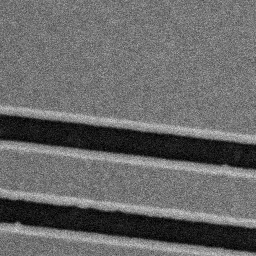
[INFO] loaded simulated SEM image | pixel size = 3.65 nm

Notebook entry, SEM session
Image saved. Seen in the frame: one or a few lines or trenches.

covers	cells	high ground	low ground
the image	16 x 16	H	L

HHHHHHHHHHHHHHHH
HHHHHHHHHHHHHHHH
HHHHHHHHHHHHHHHH
HHHHHHHHHHHHHHHH
HHHHHHHHHHHHHHHH
HHHHHHHHHHHHHHHH
HHHHHHHHHHHHHHHH
LLLLLHHHHHHHHHHH
LLLLLLLLLLLLLLHH
HHHHHLLLLLLLLLLL
HHHHHHHHHHHHHLLL
HHHHHHHHHHHHHHHH
LLLHHHHHHHHHHHHH
LLLLLLLLLLLHHHHH
HHHLLLLLLLLLLLLL
HHHHHHHHHHHHLLLL